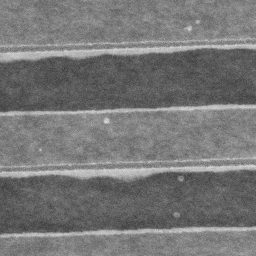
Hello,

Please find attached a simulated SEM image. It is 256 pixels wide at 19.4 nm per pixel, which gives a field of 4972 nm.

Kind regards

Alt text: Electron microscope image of lines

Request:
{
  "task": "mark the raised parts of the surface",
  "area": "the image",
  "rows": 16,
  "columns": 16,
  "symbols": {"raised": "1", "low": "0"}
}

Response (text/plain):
1111111111111111
1111111111111111
1111111111111111
0000000000000000
0000000000000000
0000000000000000
0000000000000000
1111111111111111
1111111111111111
1111111111111111
1111111111111100
0000000000000000
0000000000000000
0000000000000000
0000000011111111
1111111111111111